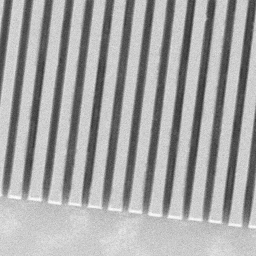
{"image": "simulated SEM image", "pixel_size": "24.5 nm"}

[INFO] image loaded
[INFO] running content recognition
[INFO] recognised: parallel lines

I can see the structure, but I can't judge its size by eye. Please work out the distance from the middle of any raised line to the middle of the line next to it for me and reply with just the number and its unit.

495 nm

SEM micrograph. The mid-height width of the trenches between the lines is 194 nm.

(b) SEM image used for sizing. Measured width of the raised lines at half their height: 12.3 pixels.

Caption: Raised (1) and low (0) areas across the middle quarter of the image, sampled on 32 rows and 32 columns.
01100011000110001110011100111001
11100011001110001100011100111001
11100111001110001100011000111001
11100111001110011100011000110001
11100111001110011100111000110011
11100111001110011100111001110011
11100111001110011100111001110011
11000111001110011100111001110011
11000110001100011100111001110011
11000110011100011000111001110011
11001110011100011000110001110011
11001110011100011001110001100011
11001110011100111001110001100111
11001110011100111001110011100111
11001110011100111001110011100111
10001110011100111001110011100111
10001100011100111001110011100111
10001100111000110001110011100111
10011100111000110001100011100111
10011100111000110011100011000111
10011100111001110011100011001110
10011100111001110011100111001110
10011100111001110011100111001110
00011100111001110011100111001110
00011000111001110011100111001110
00011001110001100011100111001110
00111001110001100011000111001110
00111001110001100011000110001110
00111001110011100111001110011100
00111001110011100111001110011100
00111001110011100111001110011100
00111001110011100111001110011100